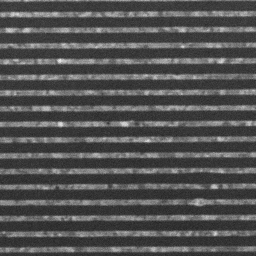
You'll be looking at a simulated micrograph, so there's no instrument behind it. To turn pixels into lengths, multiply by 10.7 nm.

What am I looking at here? parallel lines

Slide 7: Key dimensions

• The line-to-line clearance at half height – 0.123 µm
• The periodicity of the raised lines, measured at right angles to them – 0.168 microns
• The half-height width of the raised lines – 44.1 nm